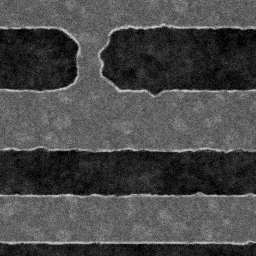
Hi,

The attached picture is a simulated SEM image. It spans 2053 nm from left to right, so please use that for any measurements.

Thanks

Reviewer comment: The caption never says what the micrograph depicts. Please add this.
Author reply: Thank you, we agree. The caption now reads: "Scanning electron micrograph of one or a few lines or trenches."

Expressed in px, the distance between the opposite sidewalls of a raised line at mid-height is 48.6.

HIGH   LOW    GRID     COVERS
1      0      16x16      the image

1111111111111111
1111111111111111
0000011000000000
0000010000000000
0000010000000000
0000111000000000
1111111111111111
1111111111111111
1111111111111111
0000000000000000
0000000000000000
0000000000000000
1111111111111111
1111111111111111
1111111111111111
0000000000000000